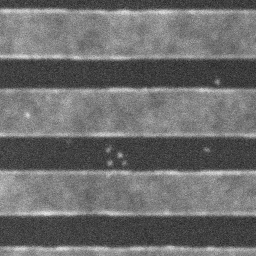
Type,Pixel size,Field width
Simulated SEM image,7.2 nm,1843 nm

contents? lines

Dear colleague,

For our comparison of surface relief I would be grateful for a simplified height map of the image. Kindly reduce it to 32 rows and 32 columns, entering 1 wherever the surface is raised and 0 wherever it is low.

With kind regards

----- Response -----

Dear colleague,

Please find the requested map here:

00000000000000000000000000000000
11111111111110110011111111111111
11111111111111111111111111111111
11111111111111111111111111111111
11111111111111111111111111111111
11111111111111111111111111111111
11111111111111111111111111111111
00000000000000000000000000000000
00000000000000000000000000000000
00000000000000000000000000000000
00000000000000000000000000000000
11111111111111111111111111111111
11111111111111111111111111111111
11111111111111111111111111111111
11111111111111111111111111111111
11111111111111111111111111111111
11111111111111111111111111111111
00000000000000000000000000000000
00000000000000000000000000000000
00000000000000000000000000000000
00000000000000000000000000000000
11111111111111111001110001111111
11111111111111111111111111111111
11111111111111111111111111111111
11111111111111111111111111111111
11111111111111111111111111111111
11111111111111111111111111111111
00000000000000000000000000000000
00000000000000000000000000000000
00000000000000000000000000000000
00000000000000000000000000000000
11111111111111111111111111111111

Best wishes